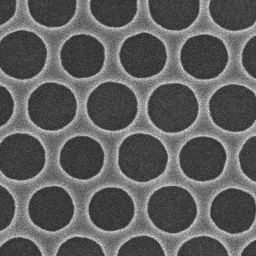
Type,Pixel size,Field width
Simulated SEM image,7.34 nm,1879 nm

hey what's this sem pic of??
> a regular array of holes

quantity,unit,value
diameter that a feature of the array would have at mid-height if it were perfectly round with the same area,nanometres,342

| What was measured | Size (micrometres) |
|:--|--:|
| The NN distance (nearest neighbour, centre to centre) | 0.434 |